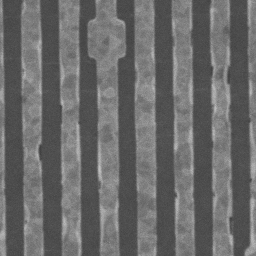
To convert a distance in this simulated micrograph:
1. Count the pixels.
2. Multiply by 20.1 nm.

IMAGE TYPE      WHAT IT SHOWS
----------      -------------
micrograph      wiring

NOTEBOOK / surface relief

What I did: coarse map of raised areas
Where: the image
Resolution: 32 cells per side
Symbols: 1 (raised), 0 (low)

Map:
00011001110011000110001100011001
00011001110011000110001100111001
00011001110011100110001100011001
00011001110111110110001100111001
00011001110111110110001100111001
00011001110111110110001100111001
00011001110111110110001100111001
00011000110011100110001100011001
00011000110011100110001100010001
00011000110011100110001100010001
00011000110011100110001100010001
00011000110011100110001100011001
00011000110011100110001100011001
00011000110011100110001100011001
00011000110011100110001100010001
00011000110011100110001100011001
00011000110011100110001100011001
00011000110011100110001100011001
00011000110011100110001100011000
00011000110011100110001100011000
00011000110011100110001100011000
00011000110011100110001100011000
00011000110001100110001100011000
00011000110001100110001100011001
00011000110011100110001100011001
10011000110011100110001100011000
10011000110001100110001100011001
00011000110001100110001100011001
00011000110001100110001100011000
00011000110001100110001100011000
00011000110001100110001100011000
00011000110001100110001100011001